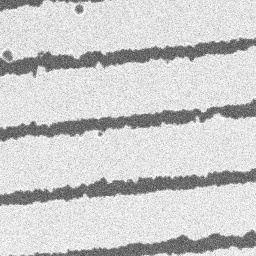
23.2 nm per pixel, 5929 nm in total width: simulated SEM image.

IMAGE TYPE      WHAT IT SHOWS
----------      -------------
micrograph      one or a few lines or trenches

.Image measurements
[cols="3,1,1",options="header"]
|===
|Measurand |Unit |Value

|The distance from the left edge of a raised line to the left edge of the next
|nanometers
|1510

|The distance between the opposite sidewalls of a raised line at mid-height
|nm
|354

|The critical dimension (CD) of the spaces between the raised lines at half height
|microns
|1.14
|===